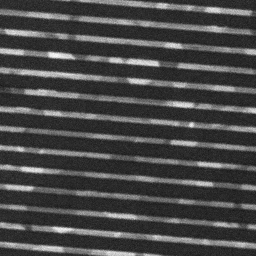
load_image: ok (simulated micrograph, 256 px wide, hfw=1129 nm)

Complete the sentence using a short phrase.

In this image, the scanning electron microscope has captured parallel lines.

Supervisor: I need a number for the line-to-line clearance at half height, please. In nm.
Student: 68.1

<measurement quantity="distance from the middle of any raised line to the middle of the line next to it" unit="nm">85.2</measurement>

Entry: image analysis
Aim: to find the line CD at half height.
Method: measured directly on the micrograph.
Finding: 17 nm